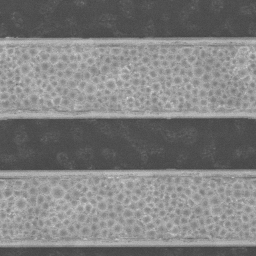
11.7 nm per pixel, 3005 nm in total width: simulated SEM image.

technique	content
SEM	one or a few lines or trenches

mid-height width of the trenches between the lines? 58.6 pixels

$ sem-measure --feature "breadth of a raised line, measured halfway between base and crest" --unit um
0.832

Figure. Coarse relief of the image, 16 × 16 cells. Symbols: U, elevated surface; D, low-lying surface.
DDDDDDDDDDDDDDDD
DDDDDDDDDDDDDDDD
DDDDDDDDDDDDDDDD
UUUUUUUUUUUUUUUU
UUUUUUUUUUUUUUUU
UUUUUUUUUUUUUUUU
UUUUUUUUUUUUUUUU
DDDDDDDDDDDDDDDD
DDDDDDDDDDDDDDDD
DDDDDDDDDDDDDDDD
DDDDDDDDDDDDDDDD
UUUUUUUUUUUUUUUU
UUUUUUUUUUUUUUUU
UUUUUUUUUUUUUUUU
UUUUUUUUUUUUUUUU
DDDDDDDDDDDDDDDD